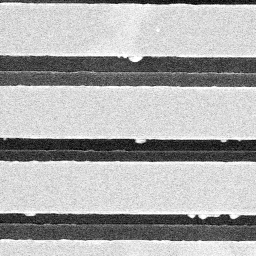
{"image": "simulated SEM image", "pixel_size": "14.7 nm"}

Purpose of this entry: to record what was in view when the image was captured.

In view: lines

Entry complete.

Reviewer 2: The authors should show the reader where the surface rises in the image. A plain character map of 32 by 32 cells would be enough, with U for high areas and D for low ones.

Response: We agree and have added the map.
UUUUDDDDDDDDDDDDDDDDDDDDDDDDDDDD
UUUUUUUUUUUUUUUUUUUUUUUUUUUUUUUU
UUUUUUUUUUUUUUUUUUUUUUUUUUUUUUUU
UUUUUUUUUUUUUUUUUUUUUUUUUUUUUUUU
UUUUUUUUUUUUUUUUUUUUUUUUUUUUUUUU
UUUUUUUUUUUUUUUUUUUUUUUUUUUUUUUU
UUUUUUUUUUUUUUUUUUUUUUUUUUUUUUUU
DDDDDDDDDDDDDDDDDDDDDDDDDDDDDDDD
DDDDDDDDDDDDDDDDDDDDDDDDDDDDDDDD
DDDDDDDDDDDDDDDDDDDDDDDDDDDDDDDD
DDDDDDDDDDDDDDDDDDDDDDDDDDDDDDDD
UUUUUUUUUUUUUUUUUUUUUUUUUUUUUUUU
UUUUUUUUUUUUUUUUUUUUUUUUUUUUUUUU
UUUUUUUUUUUUUUUUUUUUUUUUUUUUUUUU
UUUUUUUUUUUUUUUUUUUUUUUUUUUUUUUU
UUUUUUUUUUUUUUUUUUUUUUUUUUUUUUUU
UUUUUUUUUUUUUUUUUUUUUUUUUUUUUUUU
DDDDDDDDDDDDDDDDDDDDDDDDDDDDDDDD
DDDDDDDDDDDDDDDDDDDDDDDDDDDDDDDD
DDDDDDDDDDDDDDDDDDDDDDDDDDDDDDDD
UUUUUUUUUUUUUUUUUUUUUUUUUUUUUUUU
UUUUUUUUUUUUUUUUUUUUUUUUUUUUUUUU
UUUUUUUUUUUUUUUUUUUUUUUUUUUUUUUU
UUUUUUUUUUUUUUUUUUUUUUUUUUUUUUUU
UUUUUUUUUUUUUUUUUUUUUUUUUUUUUUUU
UUUUUUUUUUUUUUUUUUUUUUUUUUUUUUUU
UUUUUUUUUUUUUUUUUUUUUUUUUUUUUUUU
DDDDDDDDDDDDDDDDDDDDDDDDDDDDDDDD
DDDDDDDDDDDDDDDDDDDDDDDDDDDDDDDD
DDDDDDDDDDDDDDDDDDDDDDDDDDDDDDDD
UUUUUUUUUUUUUUUUUUUUUUUUUUUUUUUU
UUUUUUUUUUUUUUUUUUUUUUUUUUUUUUUU